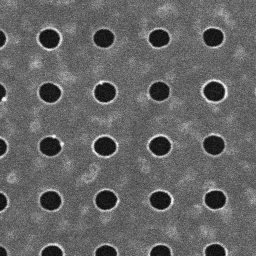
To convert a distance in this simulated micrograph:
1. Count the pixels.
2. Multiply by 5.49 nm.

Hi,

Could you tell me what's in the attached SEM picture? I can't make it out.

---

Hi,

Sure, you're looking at a regular array of holes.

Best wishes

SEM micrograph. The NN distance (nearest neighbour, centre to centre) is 296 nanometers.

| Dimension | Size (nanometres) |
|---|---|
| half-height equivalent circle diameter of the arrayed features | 115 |